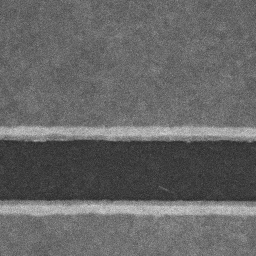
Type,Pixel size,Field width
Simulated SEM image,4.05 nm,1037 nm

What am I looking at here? one or a few lines or trenches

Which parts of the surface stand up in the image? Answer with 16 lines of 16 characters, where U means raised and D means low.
UUUUUUUUUUUUUUUU
UUUUUUUUUUUUUUUU
UUUUUUUUUUUUUUUU
UUUUUUUUUUUUUUUU
UUUUUUUUUUUUUUUU
UUUUUUUUUUUUUUUU
UUUUUUUUUUUUUUUU
UUUUUUUUUUUUUUUU
DDDDDDDDDDDDDDDD
DDDDDDDDDDDDDDDD
DDDDDDDDDDDDDDDD
DDDDDDDDDDDDDDDD
DDDDDDDDDDDDDDDD
UUUUUUUUUUUUUUUU
UUUUUUUUUUUUUUUU
UUUUUUUUUUUUUUUU